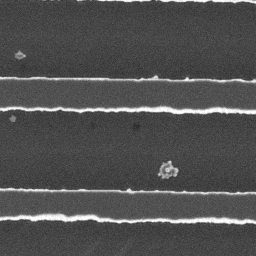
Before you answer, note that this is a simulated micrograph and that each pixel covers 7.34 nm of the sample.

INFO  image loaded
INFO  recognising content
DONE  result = lines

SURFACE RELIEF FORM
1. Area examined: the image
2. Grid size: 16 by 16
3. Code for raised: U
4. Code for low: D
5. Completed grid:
DDDDDDDDDDDDDDDD
DDDDDDDDDDDDDDDD
DDDDDDDDDDDDDDDD
DDDDDDDDDDDDDDDD
DDDDDDDDDDDDDDDD
UUUUUUUUUUUUUUUU
UUUUUUUUUUUUUUUU
DDDDDDDDDDDDDDDD
DDDDDDDDDDDDDDDD
DDDDDDDDDDDDDDDD
DDDDDDDDDDDDDDDD
DDDDDDDDDDDDDDDD
UUUUUUUUUUUUUUUU
UUUUUUUUUUUUUUUU
DDDDDDDDDDDDDDDD
DDDDDDDDDDDDDDDD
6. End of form